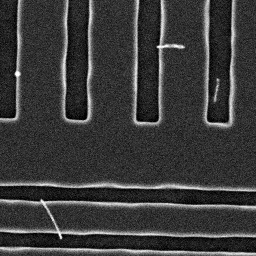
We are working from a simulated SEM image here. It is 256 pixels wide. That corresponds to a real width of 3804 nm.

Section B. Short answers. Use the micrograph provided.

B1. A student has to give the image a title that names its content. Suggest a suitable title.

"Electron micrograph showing groups of lines, slits or small figures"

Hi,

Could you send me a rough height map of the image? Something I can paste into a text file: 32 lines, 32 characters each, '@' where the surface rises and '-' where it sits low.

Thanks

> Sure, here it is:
--@@@@@@---@@@@@@---@@@@@@---@@@
--@@@@@@---@@@@@@---@@@@@@---@@@
--@@@@@@---@@@@@@---@@@@@@---@@@
--@@@@@@---@@@@@@---@@@@@@---@@@
--@@@@@@---@@@@@@---@@@@@@---@@@
--@@@@@@---@@@@@@---@@@@@@---@@@
--@@@@@@---@@@@@@---@@@@@@---@@@
--@@@@@@---@@@@@@---@@@@@@---@@@
--@@@@@@---@@@@@@---@@@@@@---@@@
--@@@@@@---@@@@@@---@@@@@@---@@@
--@@@@@@---@@@@@@---@@@@@@---@@@
--@@@@@@---@@@@@@---@@@@@@---@@@
--@@@@@@---@@@@@@---@@@@@@---@@@
--@@@@@@---@@@@@@---@@@@@@---@@@
--@@@@@@---@@@@@@---@@@@@@---@@@
@@@@@@@@@@@@@@@@@@@@@@@@@@@@@@@@
@@@@@@@@@@@@@@@@@@@@@@@@@@@@@@@@
@@@@@@@@@@@@@@@@@@@@@@@@@@@@@@@@
@@@@@@@@@@@@@@@@@@@@@@@@@@@@@@@@
@@@@@@@@@@@@@@@@@@@@@@@@@@@@@@@@
@@@@@@@@@@@@@@@@@@@@@@@@@@@@@@@@
@@@@@@@@@@@@@@@@@@@@@@@@@@@@@@@@
@@@@@@@@@@@@@@@@@@@@@@@@@@@@@@@@
-----------------@@@---@@@@@@@@@
--------------------------------
@@@@@@@@@@@@@@---@@@------------
@@@@@@@@@@@@@@@@@@@@@@@@@@@@@@@@
@@@@@@@@@@@@@@@@@@@@@@@@@@@@@@@@
@@@@@@@@@@@@@@@@@@@@@@@@@@@@@@@@
-------------------------@@@@-@@
--------------------------------
@@@@@@@@@@@@@@@@@@@@@@@@@-------